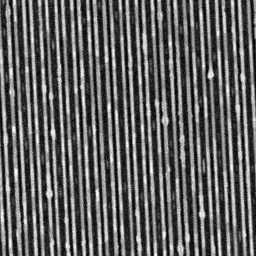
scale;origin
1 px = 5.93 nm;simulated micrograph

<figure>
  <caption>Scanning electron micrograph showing parallel lines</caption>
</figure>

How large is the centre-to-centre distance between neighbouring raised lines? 47.4 nanometers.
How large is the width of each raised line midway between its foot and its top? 14.8 nm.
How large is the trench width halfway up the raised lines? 25.1 nm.